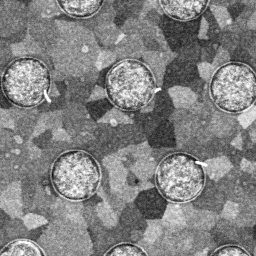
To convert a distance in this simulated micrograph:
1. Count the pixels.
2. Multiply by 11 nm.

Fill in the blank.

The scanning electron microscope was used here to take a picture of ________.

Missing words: holes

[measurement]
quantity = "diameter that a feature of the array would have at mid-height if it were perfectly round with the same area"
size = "546 nm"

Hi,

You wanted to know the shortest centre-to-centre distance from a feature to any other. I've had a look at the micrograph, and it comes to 1150 nm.